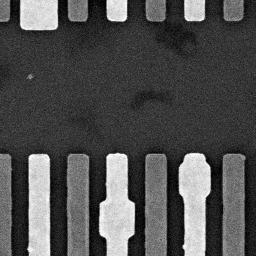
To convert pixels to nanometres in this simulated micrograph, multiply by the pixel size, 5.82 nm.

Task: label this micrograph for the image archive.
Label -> wiring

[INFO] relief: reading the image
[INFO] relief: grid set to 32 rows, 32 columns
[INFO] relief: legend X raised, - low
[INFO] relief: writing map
X--XXXX--XX--XXX--XXX--XX---XX--
X--XXXX--XX--XXX--XXX--XX---XX--
X--XXXX--XX---X----X----X---XX--
---XXXX-------------------------
--------------------------------
--------------------------------
--------------------------------
--------------------------------
--------------------------------
--------------------------------
--------------------------------
--------------------------------
--------------------------------
--------------------------------
--------------------------------
--------------------------------
--------------------------------
--------------------------------
--------------------------------
X---XX---XX---XX--XX---XX---XX--
X---XX---XX--XXX--XXX--XXX--XX--
X---XX--XXX--XXX--XXX-XXXX--XX--
X---XX--XXX--XXX--XXX-XXXX--XX--
X---XX--XXX--XXX--XXX-XXXX--XX--
X---XX--XXX--XXX--XXX--XXX--XX--
X---XX--XXX--XXXX-XXX--XXX--XX--
X---XX--XXX--XXXX-XXX--XXX--XX--
X---XX--XXX-XXXXX-XXX--XXX--XX--
X---XX---XX-XXXXX-XXX--XXX--XX--
X---XX---XX--XXX--XXX--XXX--XX--
X---XX---XX--XXX--XXX--XXX--XX--
X---XX---XX--XXX--XXX--XXX--XX--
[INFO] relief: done